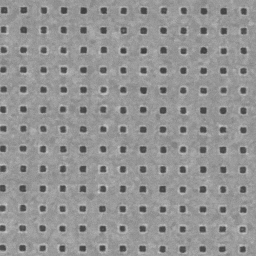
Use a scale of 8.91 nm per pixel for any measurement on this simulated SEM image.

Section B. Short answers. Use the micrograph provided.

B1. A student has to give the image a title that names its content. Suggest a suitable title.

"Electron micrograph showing a regular array of holes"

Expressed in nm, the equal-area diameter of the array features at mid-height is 68.9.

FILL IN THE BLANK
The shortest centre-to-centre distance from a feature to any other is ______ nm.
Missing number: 173